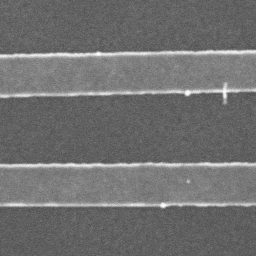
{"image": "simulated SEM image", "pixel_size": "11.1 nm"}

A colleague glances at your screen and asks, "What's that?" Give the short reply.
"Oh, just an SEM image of lines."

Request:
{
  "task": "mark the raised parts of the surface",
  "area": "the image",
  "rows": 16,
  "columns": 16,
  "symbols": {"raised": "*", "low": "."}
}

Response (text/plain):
................
................
................
****************
****************
****************
................
................
................
................
****************
****************
****************
................
................
................